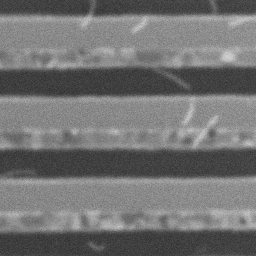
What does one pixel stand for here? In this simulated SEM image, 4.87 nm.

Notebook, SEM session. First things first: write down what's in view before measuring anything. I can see lines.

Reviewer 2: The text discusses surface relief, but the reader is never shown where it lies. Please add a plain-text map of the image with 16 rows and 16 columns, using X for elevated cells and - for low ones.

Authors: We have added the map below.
----------------
XXXXXXXXXXXXXXXX
XXXXXXXXXXXXXXXX
XXXXXXXXXXXXXXXX
----------------
----------------
XXXXXXXXXXXXXXXX
XXXXXXXXXXXXXXXX
XXXXXXXXXXXXXXXX
----------------
----------------
XXXXXXXXXXXXXXXX
XXXXXXXXXXXXXXXX
XXXXXXXXXXXXXXXX
----------------
----------------